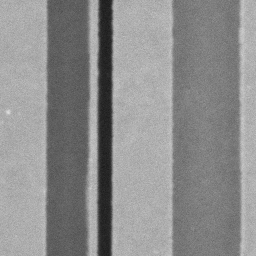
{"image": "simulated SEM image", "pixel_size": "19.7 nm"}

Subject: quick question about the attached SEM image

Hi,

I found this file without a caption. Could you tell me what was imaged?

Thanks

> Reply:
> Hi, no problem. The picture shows lines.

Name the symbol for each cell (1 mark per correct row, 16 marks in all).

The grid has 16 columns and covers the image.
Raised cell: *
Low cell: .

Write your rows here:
***....****....*
***....****....*
***....****....*
***....****....*
***....****....*
***....****....*
***....****....*
***....****....*
***....****....*
***....****....*
***....****....*
***....****....*
***....****....*
***....****....*
***....****....*
***....****....*